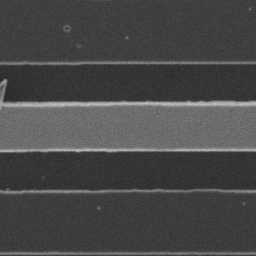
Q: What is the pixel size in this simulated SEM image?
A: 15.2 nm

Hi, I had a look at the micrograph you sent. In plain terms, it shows lines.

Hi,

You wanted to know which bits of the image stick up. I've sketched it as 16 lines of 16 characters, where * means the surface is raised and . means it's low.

****************
****************
****************
****************
................
................
****************
****************
****************
................
................
................
****************
****************
****************
****************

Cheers